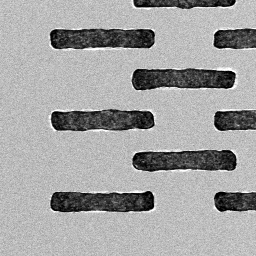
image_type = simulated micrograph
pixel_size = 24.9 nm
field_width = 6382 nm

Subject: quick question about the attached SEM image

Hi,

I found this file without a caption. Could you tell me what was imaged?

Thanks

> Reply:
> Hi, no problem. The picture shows holes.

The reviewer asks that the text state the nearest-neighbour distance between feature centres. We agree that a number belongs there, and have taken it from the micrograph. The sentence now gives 2040 nanometres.